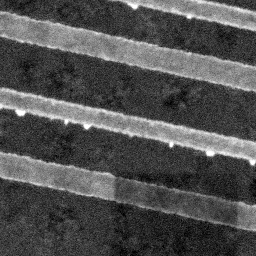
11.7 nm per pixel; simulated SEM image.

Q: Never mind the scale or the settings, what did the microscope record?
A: lines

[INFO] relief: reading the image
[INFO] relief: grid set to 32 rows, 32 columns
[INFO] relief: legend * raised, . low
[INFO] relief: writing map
................***********.....
*.....................**********
****......................******
*********......................*
**************..................
....***************.............
.........**************.........
..............**************....
..................**************
.......................*********
............................****
**..............................
******..........................
..*********.....................
......**********................
..........***********...........
................*********.......
....................**********..
.........................*******
**...........................***
*******.........................
************....................
..**************................
.......**************...........
...........***************......
................***************.
.....................***********
.........................*******
..............................**
................................
................................
................................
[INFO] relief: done